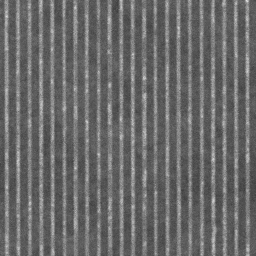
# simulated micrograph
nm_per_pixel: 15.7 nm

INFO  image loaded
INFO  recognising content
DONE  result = parallel lines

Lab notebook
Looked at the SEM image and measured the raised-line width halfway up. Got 31.4 nanometers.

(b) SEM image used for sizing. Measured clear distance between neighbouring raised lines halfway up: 139 nm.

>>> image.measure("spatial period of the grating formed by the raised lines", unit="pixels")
11.5